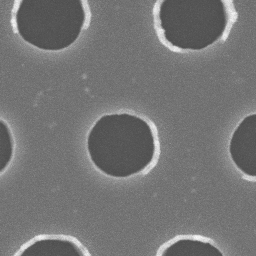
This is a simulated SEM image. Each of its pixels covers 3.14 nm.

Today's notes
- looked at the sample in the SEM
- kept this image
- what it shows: holes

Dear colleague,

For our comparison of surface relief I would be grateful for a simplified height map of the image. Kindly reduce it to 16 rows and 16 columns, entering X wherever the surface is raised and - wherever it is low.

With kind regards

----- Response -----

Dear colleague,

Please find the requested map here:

X----XXXXX----XX
X----XXXXX----XX
XX---XXXXXX---XX
XXXXXXXXXXXXXXXX
XXXXXXXXXXXXXXXX
XXXXXXXXXXXXXXXX
XXXXXXXXXXXXXXXX
XXXXXX---XXXXXX-
-XXXXX----XXXXX-
-XXXXX----XXXX--
XXXXXX---XXXXXX-
XXXXXXXXXXXXXXXX
XXXXXXXXXXXXXXXX
XXXXXXXXXXXXXXXX
XXXXXXXXXXXXXXXX
XX---XXXXXX--XXX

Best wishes